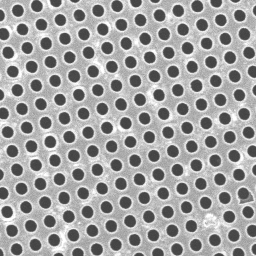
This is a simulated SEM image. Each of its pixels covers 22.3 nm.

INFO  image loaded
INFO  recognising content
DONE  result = a regular array of holes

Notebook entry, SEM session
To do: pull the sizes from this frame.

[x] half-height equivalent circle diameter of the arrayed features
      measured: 269 nm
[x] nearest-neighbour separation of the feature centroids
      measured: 429 nanometres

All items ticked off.